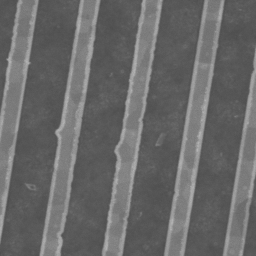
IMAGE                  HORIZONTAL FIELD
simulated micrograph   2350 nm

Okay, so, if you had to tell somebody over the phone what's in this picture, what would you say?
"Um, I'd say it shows one or a few lines or trenches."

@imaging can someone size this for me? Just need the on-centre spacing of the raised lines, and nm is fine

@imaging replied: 559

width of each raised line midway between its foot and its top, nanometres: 156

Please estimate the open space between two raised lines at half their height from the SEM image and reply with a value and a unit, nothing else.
402 nm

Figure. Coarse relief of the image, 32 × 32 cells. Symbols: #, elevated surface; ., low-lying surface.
..###.....##......##......##....
..##......##......##......##....
..##......##......##.....##.....
..##......##.....###.....##.....
..##......##.....##......##.....
..##.....##......##......##.....
.###.....##......##......##.....
.##......##......##......##.....
.##......##......##.....##......
.##......##......##.....##......
.##......##.....##......##.....#
.##.....###.....##......##.....#
.##.....##......##......##.....#
##......##......##......##.....#
##......##......##.....###.....#
##......##......##.....##......#
##.....###.....###.....##......#
##.....###.....##......##.....##
##.....##......##......##.....##
#......##......##......##.....##
#......##......##......##.....##
#......##......##.....##......##
#......##.....###.....##......##
#......##.....##......##.....##.
#.....###.....##......##.....##.
#.....##......##......##.....##.
......##......##......##.....##.
......##......##.....##......##.
......##......##.....##......##.
......#......##......##.....###.
.....###.....##......##.....##..
.....##......##......##.....##..